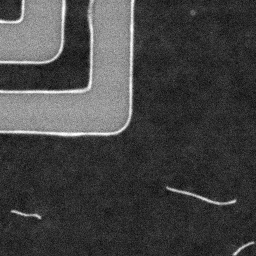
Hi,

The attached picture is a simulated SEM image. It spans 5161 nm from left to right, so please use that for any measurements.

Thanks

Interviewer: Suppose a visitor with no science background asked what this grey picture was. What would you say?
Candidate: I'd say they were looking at groups of lines, slits or small figures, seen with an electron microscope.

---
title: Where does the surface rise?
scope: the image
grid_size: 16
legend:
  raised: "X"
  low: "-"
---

X---XX--XXXXXXXX
----XX--XXXXXXXX
----XX--XXXXXXXX
---XXX--XXXXXXXX
XXXXXX--XXXXXXXX
XXXXX---XXXXXXXX
--------XXXXXXXX
--------XXXXXXXX
XXXXXXXXXXXXXXXX
XXXXXXXXXXXXXXXX
XXXXXXXXXXXXXXXX
XXXXXXXXXXXXXXXX
XXXXXXXXXXXXXXXX
XXXXXXXXXXXXXXXX
XXXXXXXXXXXXXXXX
XXXXXXXXXXXXXXXX